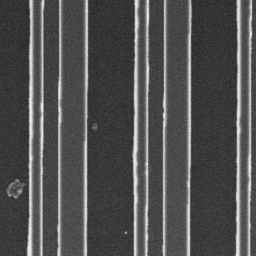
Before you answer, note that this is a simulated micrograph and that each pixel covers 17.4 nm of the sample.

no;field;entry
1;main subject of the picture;lines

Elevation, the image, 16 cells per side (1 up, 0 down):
0011100001110001
0011100001110001
0011100001110001
0011100001110001
0011100001110001
0011100011110001
0011100011110001
0011100011110001
0011100011110001
0011100011110001
0011100011110001
0011100011110001
0011100011110001
0011100011110001
0011100011110001
0011100011110001